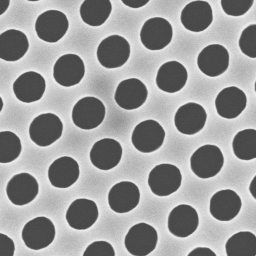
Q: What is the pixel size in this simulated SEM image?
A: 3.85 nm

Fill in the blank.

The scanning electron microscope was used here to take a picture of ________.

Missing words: a regular array of holes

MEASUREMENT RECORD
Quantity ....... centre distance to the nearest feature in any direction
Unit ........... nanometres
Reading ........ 172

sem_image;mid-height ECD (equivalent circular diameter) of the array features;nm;123